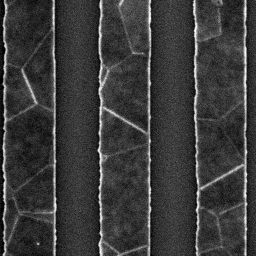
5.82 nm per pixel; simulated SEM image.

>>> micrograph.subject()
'lines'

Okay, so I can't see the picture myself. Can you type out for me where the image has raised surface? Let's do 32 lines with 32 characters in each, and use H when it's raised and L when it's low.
LHHHHHHLLLLLLHHHHHHLLLLLHHHHHHHL
LHHHHHHLLLLLLHHHHHHLLLLLHHHHHHHL
HHHHHHHLLLLLLHHHHHHLLLLLHHHHHHHL
HHHHHHHLLLLLHHHHHHHLLLLLHHHHHHHL
HHHHHHHLLLLLHHHHHHHLLLLLHHHHHHHL
LHHHHHHLLLLLHHHHHHHLLLLLHHHHHHHL
LHHHHHHLLLLLHHHHHHHLLLLLHHHHHHHL
LHHHHHHLLLLLLHHHHHHLLLLLHHHHHHHL
HHHHHHHLLLLLLHHHHHHLLLLLHHHHHHHL
HHHHHHHLLLLLHHHHHHHLLLLLHHHHHHHL
HHHHHHHLLLLLLHHHHHHLLLLLHHHHHHHL
HHHHHHHLLLLLHHHHHHHLLLLLHHHHHHHL
HHHHHHHLLLLLLHHHHHHLLLLLHHHHHHHL
LHHHHHHLLLLLLHHHHHHLLLLLHHHHHHHL
LHHHHHHLLLLLLHHHHHHLLLLLHHHHHHHL
LHHHHHHLLLLLLHHHHHHLLLLLHHHHHHHL
HHHHHHHLLLLLHHHHHHHLLLLLHHHHHHHL
HHHHHHHLLLLLHHHHHHHLLLLLLHHHHHHL
HHHHHHHLLLLLHHHHHHHLLLLLLHHHHHHL
HHHHHHHLLLLLLHHHHHHLLLLLLHHHHHHL
HHHHHHHLLLLLLHHHHHHLLLLLLHHHHHHL
HHHHHHHLLLLLLHHHHHHLLLLLLHHHHHHL
HHHHHHHLLLLLLHHHHHHLLLLLLHHHHHHL
HHHHHHHLLLLLLHHHHHHLLLLLLHHHHHHL
HHHHHHHLLLLLHHHHHHHLLLLLLHHHHHHL
LHHHHHHLLLLLLHHHHHHLLLLLLHHHHHHL
HHHHHHHLLLLLLHHHHHHLLLLLLHHHHHHL
HHHHHHHLLLLLLHHHHHHLLLLLLHHHHHHL
HHHHHHHLLLLLLHHHHHHLLLLLLHHHHHHL
HHHHHHHLLLLLLHHHHHHLLLLLLHHHHHHL
LHHHHHHLLLLLHHHHHHHLLLLLLHHHHHHL
HHHHHHHLLLLLLHHHHHHLLLLLLHHHHHHL